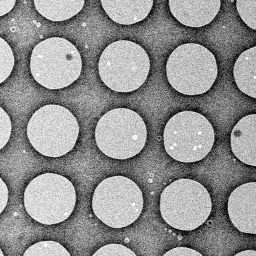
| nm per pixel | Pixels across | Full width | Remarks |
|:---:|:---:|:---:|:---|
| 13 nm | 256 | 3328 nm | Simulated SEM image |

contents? an array of small figures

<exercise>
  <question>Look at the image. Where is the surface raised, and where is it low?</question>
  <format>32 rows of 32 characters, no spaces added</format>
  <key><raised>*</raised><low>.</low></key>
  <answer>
**..******...******..******...**
*....*****...******..******...**
......**......****....****....**
...............................*
................................
*....****.....***......*........
**..******...*****....****.....*
**..******..*******..******...**
**..******..*******..******..***
*...******...*****...******..***
.....****....*****...******...**
.......................***....**
................................
.....***........................
*...*****....****.....***......*
*...******..******...*****....**
*..*******..******...******..***
*...******..******...******..***
....*****...******...*****...***
......*.......***....*****....**
...............................*
................................
....****.....***......**........
*..******...*****....*****....**
*..******...******..******...***
*..******...******..******...***
...******...******..******...***
....****.....****....*****...***
......................**......**
................................
....***.........................
...*****....*****....****.....**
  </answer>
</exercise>